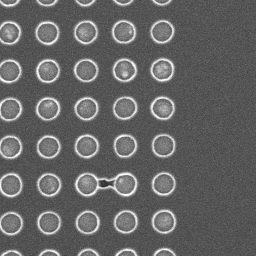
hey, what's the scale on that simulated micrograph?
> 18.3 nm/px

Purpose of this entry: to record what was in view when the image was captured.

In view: a regular array of holes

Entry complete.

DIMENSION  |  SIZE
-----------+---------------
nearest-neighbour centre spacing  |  690 nm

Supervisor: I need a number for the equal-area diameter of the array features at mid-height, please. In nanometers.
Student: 374